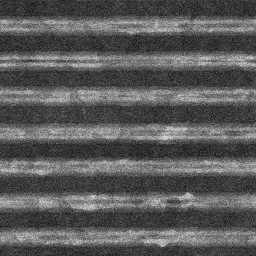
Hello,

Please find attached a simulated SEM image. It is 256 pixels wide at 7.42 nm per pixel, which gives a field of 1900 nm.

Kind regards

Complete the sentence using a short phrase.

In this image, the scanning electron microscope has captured parallel lines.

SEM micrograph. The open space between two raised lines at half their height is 162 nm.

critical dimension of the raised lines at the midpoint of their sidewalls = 13.9 pixels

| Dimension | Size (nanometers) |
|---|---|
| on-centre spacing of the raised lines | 261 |